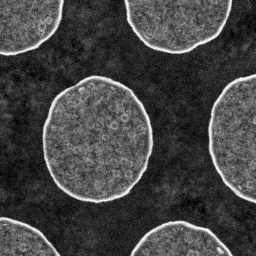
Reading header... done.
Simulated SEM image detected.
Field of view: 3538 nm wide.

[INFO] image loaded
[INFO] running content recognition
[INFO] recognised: raised bodies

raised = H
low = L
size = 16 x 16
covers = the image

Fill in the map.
HHHHLLLLHHHHHHLL
HHHHLLLLHHHHHHLL
HHHLLLLLLHHHHLLL
LLLLLLLLLLLLLLLL
LLLLLLLLLLLLLLLL
LLLLHHHHLLLLLLHH
LLLHHHHHHLLLLLHH
LLLHHHHHHLLLLHHH
LLLHHHHHHLLLLHHH
LLLHHHHHHLLLLHHH
LLLHHHHHHLLLLLHH
LLLLHHHHLLLLLLHH
LLLLLLHLLLLLLLLL
LLLLLLLLLLLLLLLL
HHLLLLLLLLHHHLLL
HHHLLLLLLHHHHHLL